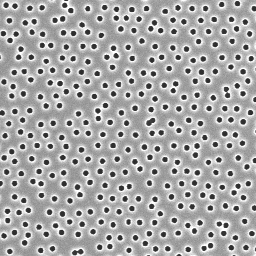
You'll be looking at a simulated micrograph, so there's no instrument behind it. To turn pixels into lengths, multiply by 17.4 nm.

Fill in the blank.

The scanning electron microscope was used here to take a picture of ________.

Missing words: a regular array of holes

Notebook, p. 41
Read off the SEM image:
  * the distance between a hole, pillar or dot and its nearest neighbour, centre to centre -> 193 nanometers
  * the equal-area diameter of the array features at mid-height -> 5.75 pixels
